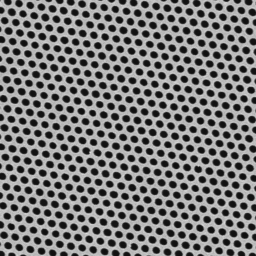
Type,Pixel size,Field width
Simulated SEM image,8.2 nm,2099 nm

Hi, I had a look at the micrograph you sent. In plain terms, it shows a regular array of holes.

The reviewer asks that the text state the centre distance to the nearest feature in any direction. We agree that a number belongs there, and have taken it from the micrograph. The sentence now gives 0.0902 microns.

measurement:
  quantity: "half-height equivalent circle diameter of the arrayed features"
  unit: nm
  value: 61.4